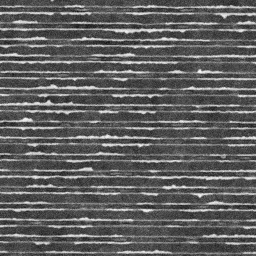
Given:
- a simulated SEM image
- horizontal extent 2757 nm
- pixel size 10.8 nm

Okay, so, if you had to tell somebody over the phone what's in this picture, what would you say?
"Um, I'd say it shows parallel lines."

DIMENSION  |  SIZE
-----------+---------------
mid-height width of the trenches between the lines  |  52.5 nanometres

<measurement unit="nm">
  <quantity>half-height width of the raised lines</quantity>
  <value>125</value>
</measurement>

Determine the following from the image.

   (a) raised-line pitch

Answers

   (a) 0.176 um